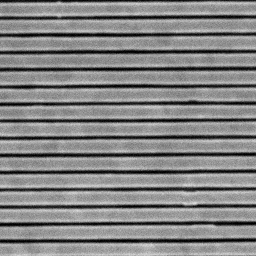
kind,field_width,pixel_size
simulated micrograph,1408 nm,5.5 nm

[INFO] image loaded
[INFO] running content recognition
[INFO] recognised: parallel lines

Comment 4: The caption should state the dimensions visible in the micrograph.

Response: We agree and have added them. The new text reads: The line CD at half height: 0.0673 µm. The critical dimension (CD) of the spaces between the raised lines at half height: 25.4 nanometres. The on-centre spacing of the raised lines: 0.0944 micrometres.